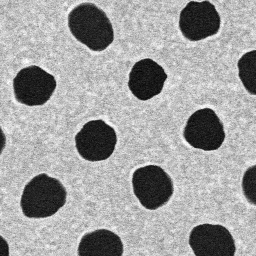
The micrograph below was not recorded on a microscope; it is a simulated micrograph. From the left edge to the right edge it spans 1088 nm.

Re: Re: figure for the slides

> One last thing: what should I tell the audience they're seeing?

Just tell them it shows holes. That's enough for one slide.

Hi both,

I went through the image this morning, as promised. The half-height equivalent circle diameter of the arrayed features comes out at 175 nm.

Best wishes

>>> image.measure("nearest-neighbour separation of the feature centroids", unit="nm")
324